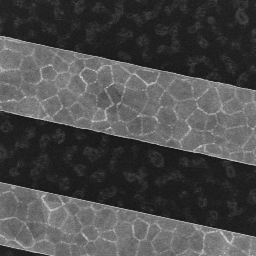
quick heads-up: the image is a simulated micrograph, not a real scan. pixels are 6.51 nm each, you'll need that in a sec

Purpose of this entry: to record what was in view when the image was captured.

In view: one or a few lines or trenches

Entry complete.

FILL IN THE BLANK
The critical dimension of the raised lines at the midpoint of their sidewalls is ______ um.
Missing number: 0.475